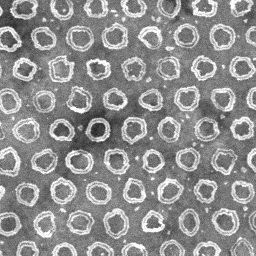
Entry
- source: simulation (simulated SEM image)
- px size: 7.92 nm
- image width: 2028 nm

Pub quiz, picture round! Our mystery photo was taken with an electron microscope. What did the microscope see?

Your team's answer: a regular array of ring-shaped raised bodies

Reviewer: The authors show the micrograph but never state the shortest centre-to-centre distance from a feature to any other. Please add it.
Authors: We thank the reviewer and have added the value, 278 nm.